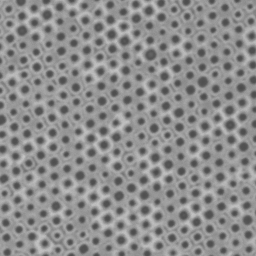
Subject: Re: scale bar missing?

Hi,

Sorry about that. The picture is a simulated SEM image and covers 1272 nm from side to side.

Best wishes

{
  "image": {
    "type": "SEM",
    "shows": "a regular array of holes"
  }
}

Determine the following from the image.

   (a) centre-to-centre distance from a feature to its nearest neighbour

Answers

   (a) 14.4 px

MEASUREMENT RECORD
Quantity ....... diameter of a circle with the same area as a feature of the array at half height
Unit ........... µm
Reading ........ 0.0359